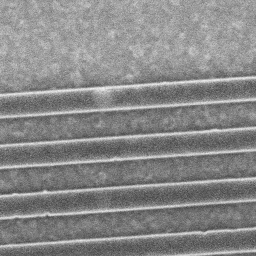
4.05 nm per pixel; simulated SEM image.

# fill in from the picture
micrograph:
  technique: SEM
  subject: parallel lines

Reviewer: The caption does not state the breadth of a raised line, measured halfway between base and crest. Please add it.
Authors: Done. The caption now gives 0.0938 um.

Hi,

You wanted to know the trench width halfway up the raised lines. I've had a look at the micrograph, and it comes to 0.113 microns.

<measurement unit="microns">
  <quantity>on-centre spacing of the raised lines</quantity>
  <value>0.204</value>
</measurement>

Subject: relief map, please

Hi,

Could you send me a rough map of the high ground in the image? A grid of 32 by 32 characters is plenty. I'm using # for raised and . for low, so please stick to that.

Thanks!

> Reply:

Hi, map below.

................................
................................
................................
................................
................................
................................
................................
................................
................................
................................
...................#############
.....###########################
###############################.
#################...............
###.............................
................................
.........................#######
...........#####################
################################
#####################...........
########........................
................................
.............................###
.............###################
################################
#########################.......
############....................
................................
................................
..................##############
....############################
###############################.